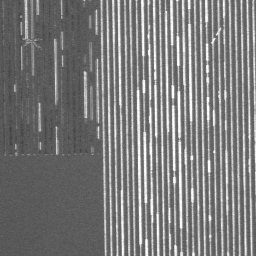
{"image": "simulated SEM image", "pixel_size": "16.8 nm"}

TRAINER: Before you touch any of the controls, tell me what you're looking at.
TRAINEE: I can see parallel lines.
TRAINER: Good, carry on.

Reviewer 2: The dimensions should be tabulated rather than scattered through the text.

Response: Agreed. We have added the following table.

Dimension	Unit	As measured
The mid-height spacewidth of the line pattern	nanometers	77.7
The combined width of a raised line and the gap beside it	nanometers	98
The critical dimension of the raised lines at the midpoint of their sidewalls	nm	16.8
